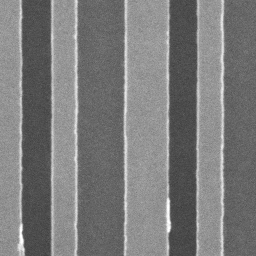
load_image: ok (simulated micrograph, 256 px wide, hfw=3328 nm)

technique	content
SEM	lines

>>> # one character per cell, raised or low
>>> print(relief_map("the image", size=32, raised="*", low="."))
***....**.......*****....***....
***....**.......*****....***....
***....**.......*****....***....
***....**.......*****....***....
***...***.......*****....***....
***...***.......*****....***....
***....**.......*****....***....
***....**.......*****....***....
***....**.......*****....***....
***....**.......*****....***....
***....**.......*****....***....
***....**.......*****....***....
***....**.......*****....***....
***....***......*****....***....
***....***......*****....***....
***....**.......*****....***....
***....**.......*****....***....
***....**.......*****....***....
***....**.......*****....***....
***....**.......*****....***....
***....**.......*****....***....
***....**.......*****....***....
***...***.......*****....***....
***....**.......*****....***....
***....**.......*****....***....
***....**.......*****....***....
***....**.......*****....***....
***....**.......*****....***....
***....**.......*****....***....
***....**.......*****....***....
***....**.......*****....***....
***....**.......*****....***....